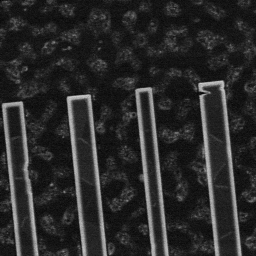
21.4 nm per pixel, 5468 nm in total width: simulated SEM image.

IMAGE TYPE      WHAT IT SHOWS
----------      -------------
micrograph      one or a few lines or trenches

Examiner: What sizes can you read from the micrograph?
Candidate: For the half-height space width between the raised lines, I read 1020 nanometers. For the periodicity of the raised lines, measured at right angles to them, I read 1.43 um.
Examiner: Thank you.